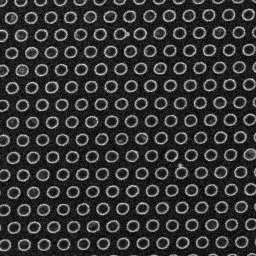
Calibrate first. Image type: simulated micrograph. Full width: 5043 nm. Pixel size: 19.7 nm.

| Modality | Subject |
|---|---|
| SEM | a regular array of raised bodies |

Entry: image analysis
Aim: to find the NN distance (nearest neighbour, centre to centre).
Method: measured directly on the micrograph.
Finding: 0.387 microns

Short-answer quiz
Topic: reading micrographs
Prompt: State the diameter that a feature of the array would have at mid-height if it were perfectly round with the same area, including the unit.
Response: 231 nanometers